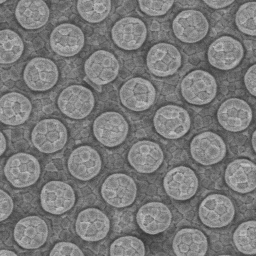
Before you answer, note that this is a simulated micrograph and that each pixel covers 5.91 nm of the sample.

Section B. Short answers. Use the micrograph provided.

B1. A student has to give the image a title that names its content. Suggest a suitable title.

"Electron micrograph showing a regular array of raised bodies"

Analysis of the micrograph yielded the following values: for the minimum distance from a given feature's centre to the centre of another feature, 43.4 pixels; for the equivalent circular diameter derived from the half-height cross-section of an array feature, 200 nanometers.